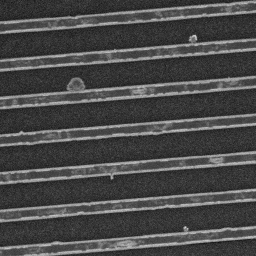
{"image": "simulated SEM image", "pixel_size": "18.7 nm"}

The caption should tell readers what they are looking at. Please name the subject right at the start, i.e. parallel lines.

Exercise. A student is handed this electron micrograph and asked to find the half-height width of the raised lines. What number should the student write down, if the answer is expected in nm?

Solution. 200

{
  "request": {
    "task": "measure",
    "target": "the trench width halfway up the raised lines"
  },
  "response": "500 nm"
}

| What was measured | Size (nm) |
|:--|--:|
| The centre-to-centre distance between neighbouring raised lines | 699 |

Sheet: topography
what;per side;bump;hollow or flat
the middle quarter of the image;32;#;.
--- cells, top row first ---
................................
................................
................................
................................
..##............................
..##................############
........########################
##########################......
##############..................
##..............................
................................
................................
................................
................................
.........................#######
.............###################
.##############################.
###################.............
#######.........................
................................
................................
................................
................................
..............................##
..................##############
......##########################
#####################...........
#############...................
................................
................................
................................
................................